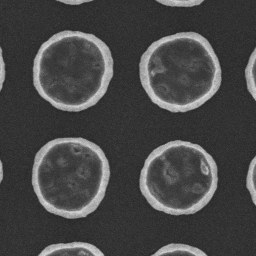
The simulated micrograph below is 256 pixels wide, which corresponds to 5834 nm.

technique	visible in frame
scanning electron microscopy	raised bodies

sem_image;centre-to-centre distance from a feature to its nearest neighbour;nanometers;2420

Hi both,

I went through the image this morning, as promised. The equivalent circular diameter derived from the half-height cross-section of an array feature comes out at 1690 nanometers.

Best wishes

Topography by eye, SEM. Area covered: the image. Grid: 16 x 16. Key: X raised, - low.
----------------
----------------
---XXX----XXX---
--XXXXX--XXXX---
--XXXXX--XXXXX--
--XXXX---XXXX---
---XXX----XX----
----------------
----------------
---XXX----XXX---
--XXXXX--XXXX---
--XXXX---XXXX---
---XXX----XXX---
----------------
----------------
---XXX----------